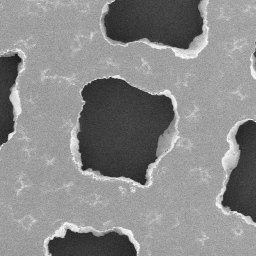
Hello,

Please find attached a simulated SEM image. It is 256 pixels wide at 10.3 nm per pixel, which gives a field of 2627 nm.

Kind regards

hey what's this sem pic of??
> holes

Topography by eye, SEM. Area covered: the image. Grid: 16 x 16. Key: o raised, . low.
ooooooo......ooo
oooooo.......ooo
ooooooo.....oooo
.ooooooooooooooo
.ooooooooooooooo
.oooo....ooooooo
.oooo......ooooo
.oooo......ooooo
.oooo......oooo.
ooooo.....ooooo.
ooooo....ooooo..
oooooooooooooo..
oooooooooooooo..
ooooooooooooooo.
oooo.o..oooooooo
ooo.....oooooooo